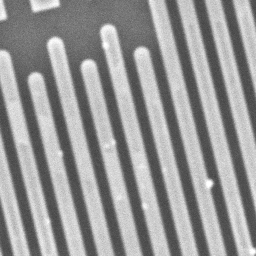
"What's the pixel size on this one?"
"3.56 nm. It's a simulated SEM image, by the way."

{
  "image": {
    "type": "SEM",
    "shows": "groups of lines, slits or small figures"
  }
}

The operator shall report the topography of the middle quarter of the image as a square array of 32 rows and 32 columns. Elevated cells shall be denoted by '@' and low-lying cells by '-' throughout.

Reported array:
@----@@@---@@@@---@@@@---@@@@---
@----@@@----@@@----@@@----@@@---
@----@@@----@@@----@@@----@@@---
@@---@@@@---@@@@---@@@@---@@@@--
@@---@@@@---@@@@---@@@@---@@@@--
@@----@@@---@@@@----@@@----@@@--
@@----@@@----@@@----@@@----@@@--
@@@---@@@@---@@@@---@@@@---@@@@-
@@@---@@@@---@@@@---@@@@---@@@@-
@@@---@@@@----@@@---@@@@----@@@-
@@@----@@@----@@@----@@@----@@@-
@@@@---@@@----@@@@---@@@----@@@@
@@@@---@@@@---@@@@---@@@@---@@@@
@@@@----@@@---@@@@----@@@----@@@
-@@@----@@@----@@@----@@@----@@@
-@@@----@@@@---@@@----@@@@---@@@
-@@@@---@@@@---@@@@---@@@@---@@@
--@@@---@@@@---@@@@---@@@@---@@@
--@@@----@@@----@@@----@@@----@@
--@@@@---@@@@---@@@@---@@@----@@
--@@@@---@@@@---@@@@---@@@@---@@
--@@@@---@@@@---@@@@---@@@@----@
---@@@----@@@----@@@----@@@----@
---@@@----@@@@---@@@----@@@----@
---@@@@---@@@@---@@@@---@@@@---@
---@@@@---@@@@---@@@@---@@@@---@
----@@@----@@@----@@@----@@@----
----@@@----@@@----@@@----@@@----
@---@@@@---@@@@---@@@@---@@@@---
@---@@@@---@@@@---@@@@---@@@@---
@----@@@----@@@---@@@@----@@@---
@----@@@----@@@----@@@----@@@---